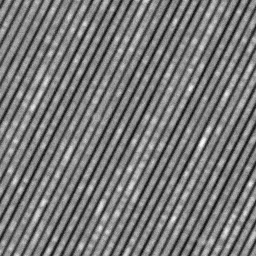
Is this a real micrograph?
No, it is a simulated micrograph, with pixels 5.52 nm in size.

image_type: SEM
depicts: parallel lines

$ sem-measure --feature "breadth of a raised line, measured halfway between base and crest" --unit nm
34.5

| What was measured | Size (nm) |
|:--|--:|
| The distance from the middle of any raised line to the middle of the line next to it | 48.5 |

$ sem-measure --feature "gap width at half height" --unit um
0.0147